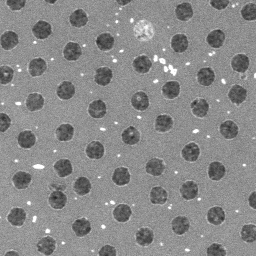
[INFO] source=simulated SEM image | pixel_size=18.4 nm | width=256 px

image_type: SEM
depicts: a regular array of raised bodies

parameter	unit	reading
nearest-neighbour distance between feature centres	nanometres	604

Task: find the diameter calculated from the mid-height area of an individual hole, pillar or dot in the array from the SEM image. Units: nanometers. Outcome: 364